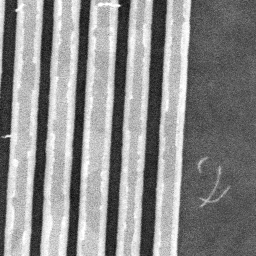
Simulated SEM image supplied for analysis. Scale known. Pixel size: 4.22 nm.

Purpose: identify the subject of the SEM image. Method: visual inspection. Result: parallel lines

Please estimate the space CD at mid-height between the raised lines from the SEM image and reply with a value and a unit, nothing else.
65.8 nm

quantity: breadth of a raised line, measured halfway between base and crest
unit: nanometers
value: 88.4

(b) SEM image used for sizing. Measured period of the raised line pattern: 36.9 pixels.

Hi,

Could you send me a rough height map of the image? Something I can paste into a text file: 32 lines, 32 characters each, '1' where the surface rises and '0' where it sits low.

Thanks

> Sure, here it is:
00111001110011100110011000000000
00111001110011000110011000000000
00111001110011001110011000000000
00111001100111000110011000000000
00111001110111001100011000000000
00111001100111001100011000000000
00111001100111001100011000000000
00111001100111001100011000000000
00111001100111001100011000000000
00111001100111001100011000000000
00111001100111001100011000000000
00111001100111001100011000000000
00110001100111001100111000000000
00110011100111001100111000000000
00110011100111001100111000000000
00110011100111001100111000000000
00110011100111001100111000000000
00110011100110001100111000000000
00110011100110001100110000000000
00110011100110001100110000000000
00110011101110001100110000000000
01110011101110011100110000000000
01110011001110011100110000000000
01110011001110011100110000000000
01110011001110011000110000000000
01110011001110011000110000000000
01110011001110011000110000000000
01110011001110011000110000000000
01110011001110011000110000000000
01100011001110011000110000000000
01100011001110011001110000000000
01100111001110011001110000000000